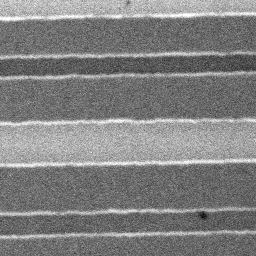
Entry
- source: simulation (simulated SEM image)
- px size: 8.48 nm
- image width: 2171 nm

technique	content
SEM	lines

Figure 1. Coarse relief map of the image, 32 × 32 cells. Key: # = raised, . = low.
................................
................................
################################
################################
################################
################################
################################
................................
................................
........##..####################
################################
################################
################################
################################
################################
.##.............................
................................
................................
................................
................................
..........#..###################
################################
################################
################################
################################
################################
##############..................
................................
................................
....############################
################################
################################